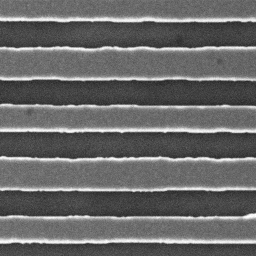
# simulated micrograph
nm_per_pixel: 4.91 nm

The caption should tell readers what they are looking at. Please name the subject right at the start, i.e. lines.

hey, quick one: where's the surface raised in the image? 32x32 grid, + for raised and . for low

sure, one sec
++++++++++++++++++++++++++++++++
++++++++++++++++++++++++++++++++
.+++++++++++++++++++++++++++++++
................................
................................
................................
++++++++++++++++++++++++++++++++
++++++++++++++++++++++++++++++++
++++++++++++++++++++++++++++++++
++++++++++++++++++++++++++++++++
................................
................................
................................
++++++++++++++++++++++++++++++++
++++++++++++++++++++++++++++++++
++++++++++++++++++++++++++++++++
........+...............++....+.
................................
................................
................................
++++++++++++++++++++++++++++++++
++++++++++++++++++++++++++++++++
++++++++++++++++++++++++++++++++
++++++++++++++++++++++++++++++++
................................
................................
................................
++++++++++++++++++++++++++++++++
++++++++++++++++++++++++++++++++
++++++++++++++++++++++++++++++++
................................
................................